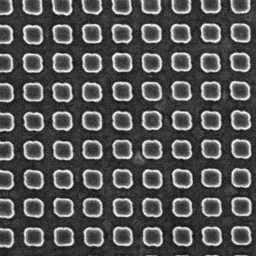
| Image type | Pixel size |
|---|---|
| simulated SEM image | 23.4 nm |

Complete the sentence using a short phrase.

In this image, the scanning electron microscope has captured a regular array of raised bodies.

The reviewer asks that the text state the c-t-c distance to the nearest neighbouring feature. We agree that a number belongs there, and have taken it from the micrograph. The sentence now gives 0.673 microns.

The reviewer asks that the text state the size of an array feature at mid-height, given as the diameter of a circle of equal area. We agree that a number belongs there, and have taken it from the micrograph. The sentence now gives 444 nanometers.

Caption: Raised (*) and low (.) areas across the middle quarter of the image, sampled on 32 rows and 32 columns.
**...****...*****...****...****.
**...****....***....****......*.
................................
................................
................................
*....****...*****...****...****.
**...****...*****...****...*****
**...****...*****...****...*****
**...****....****...****....***.
................................
................................
................................
*....****...****....****...****.
**...****...*****...****...*****
**...****...*****...****...*****
**...****...*****...****...*****
................................
................................
................................
.....***.....***....****....***.
**...****....****...****...*****
**...****....****...****...*****
**...****....****...****...*****
**....***......*................
................................
................................
................................
**...****....****...****...*****
**...****....****...****...*****
**...****....****...****...*****
**....***....****....***.....**.
................................